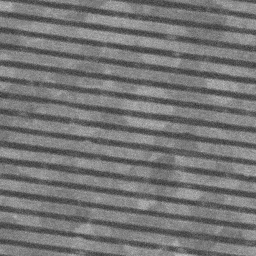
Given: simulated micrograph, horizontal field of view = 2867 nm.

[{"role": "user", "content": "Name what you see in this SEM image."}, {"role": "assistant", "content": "parallel lines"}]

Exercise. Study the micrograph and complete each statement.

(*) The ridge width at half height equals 98.5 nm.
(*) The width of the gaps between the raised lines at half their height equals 79.1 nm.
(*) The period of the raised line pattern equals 180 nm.